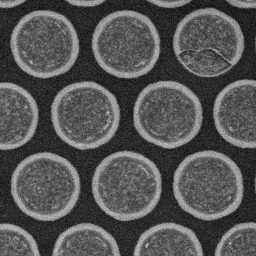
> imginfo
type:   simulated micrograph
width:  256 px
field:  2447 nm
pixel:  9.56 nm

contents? a regular array of raised bodies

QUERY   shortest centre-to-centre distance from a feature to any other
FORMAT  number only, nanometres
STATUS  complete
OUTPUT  778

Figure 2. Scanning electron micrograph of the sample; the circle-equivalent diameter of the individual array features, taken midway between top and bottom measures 599 nm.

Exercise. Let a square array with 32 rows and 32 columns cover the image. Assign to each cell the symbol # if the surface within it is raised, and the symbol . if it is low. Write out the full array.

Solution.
#...................##........##
.........................##.....
...#####.....#####.....######...
..#######....######....#######..
..#######...#######...########..
..#######...########..########..
..#######...########.......###..
..#######...#######.........#...
...#####.....#####..............
................................
....................#.........##
###.....#####.....#####.....####
####...#######...#######...#####
####...#######...########..#####
####...########..########..#####
####...#######...########..#####
####...#######....######....####
###.....#####......####......###
................................
..............###.......###.....
...#####.....######....######...
..#######...########..########..
..########..########..########..
..########..########..########..
..#######...########..########..
...######....######....######...
...#####......####......####....
................................
##........##........##........##
###.....#####.....######....####
####...#######....#######...####
#####..#######...########..#####